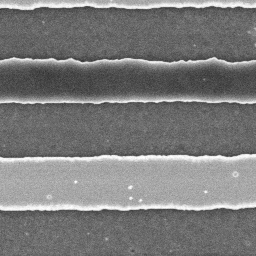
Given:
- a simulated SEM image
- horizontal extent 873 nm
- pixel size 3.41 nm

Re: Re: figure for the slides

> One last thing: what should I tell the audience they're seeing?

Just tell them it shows lines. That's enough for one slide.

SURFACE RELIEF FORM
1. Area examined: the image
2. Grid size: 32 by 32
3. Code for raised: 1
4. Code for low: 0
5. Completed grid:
11111111111111111111111111111111
00000000000000000000000000000000
00000000000000000000000000000000
00000000000000000000000000000000
00000000000000000000000000000000
00000000000000000000000000000000
00000000000000000000000000000000
11111110100011111100000001110000
11111111111111111111111111111111
11111111111111111111111111111111
11111111111111111111111111111111
11111111111111111111111111111111
11111111111111111111111111111111
00000000000000000000000000000000
00000000000000000000000000000000
00000000000000000000000000000000
00000000000000000000000000000000
00000000000000000000000000000000
00000000000000000000000000000000
00000000000001100011111100000011
11111111111111111111111111111111
11111111111111111111111111111111
11111111111111111111111111111111
11111111111111111111111111111111
11111111111111111111111111111111
11111111111111111111111111111111
00000000000000000000000000000000
00000000000000000000000000000000
00000000000000000000000000000000
00000000000000000000000000000000
00000000000000000000000000000000
00000000000000000000000000000000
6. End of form